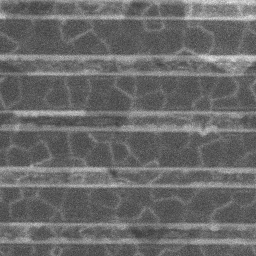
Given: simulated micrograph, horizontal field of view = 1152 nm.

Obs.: parallel lines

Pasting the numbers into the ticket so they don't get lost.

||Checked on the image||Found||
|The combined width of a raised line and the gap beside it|252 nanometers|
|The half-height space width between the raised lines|170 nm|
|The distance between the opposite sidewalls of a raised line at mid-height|82.8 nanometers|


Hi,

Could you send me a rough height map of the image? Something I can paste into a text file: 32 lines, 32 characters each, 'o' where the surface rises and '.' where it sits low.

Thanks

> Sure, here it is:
oooooooooooooooooooooooooooooooo
oooooooooooooooooooooooooooooooo
................................
................................
................................
................................
................................
oooooooooooooooooooooooooooooooo
oooooooooooooooooooooooooooooooo
................................
................................
................................
................................
................................
oooooooooooooooooooooooooooooooo
oooooooooooooooooooooooooooooooo
.........................o......
................................
................................
................................
................................
oooooooooooooooooooooooooooooooo
oooooooooooooooooooooooooooooooo
................................
................................
................................
................................
................................
oooooooooooooooooooooooooooooooo
oooooooooooooooooooooooooooooooo
................................
................................